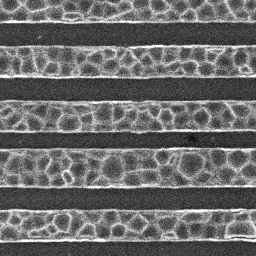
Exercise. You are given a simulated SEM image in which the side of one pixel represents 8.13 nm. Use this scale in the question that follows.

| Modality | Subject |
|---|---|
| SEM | parallel lines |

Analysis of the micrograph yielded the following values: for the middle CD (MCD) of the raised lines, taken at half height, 254 nm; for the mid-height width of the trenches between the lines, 186 nanometers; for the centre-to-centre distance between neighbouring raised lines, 54.6 pixels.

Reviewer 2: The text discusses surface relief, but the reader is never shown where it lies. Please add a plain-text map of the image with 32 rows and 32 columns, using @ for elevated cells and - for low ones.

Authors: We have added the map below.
@@@@@@@@@@@@@@@@@@@@@@@@@@@@@@@@
@@@@@@@@@@@@@@@@@@@@@@@@@@@@@@@@
@@@@@@@@@@@@@@@@@@@@@@@@@@@@@@@@
--------------------------------
--------------------------------
--------------------------------
@@@@@@@@@@@@@@@@@@@@@@@@@@@@@@@@
@@@@@@@@@@@@@@@@@@@@@@@@@@@@@@@@
@@@@@@@@@@@@@@@@@@@@@@@@@@@@@@@@
@@@@@@@@@@@@@@@@@@@@@@@@@@@@@@@@
--------------------------------
--------------------------------
--------------------------------
@@@@@@@@@@@@@@@@@@@@@@@@@@@@@@@@
@@@@@@@@@@@@@@@@@@@@@@@@@@@@@@@@
@@@@@@@@@@@@@@@@@@@@@@@@@@@@@@@@
--@@@@-----------@--------------
--------------------------------
----------------------@@--------
@@@@@@@@@@@@@@@@@@@@@@@@@@@@@@@@
@@@@@@@@@@@@@@@@@@@@@@@@@@@@@@@@
@@@@@@@@@@@@@@@@@@@@@@@@@@@@@@@@
@@@@@@@@@@@@@@@@@@@@@@@@@@@@@@@@
--------------------------------
--------------------------------
--------------------------------
@@@@@@@@@@@@@@@@@@@@@@@@@@@@@@@@
@@@@@@@@@@@@@@@@@@@@@@@@@@@@@@@@
@@@@@@@@@@@@@@@@@@@@@@@@@@@@@@@@
@@@@@@@@@@@@@@@@@@@@@@@@@@@@@@@@
--------------------------------
--------------------------------